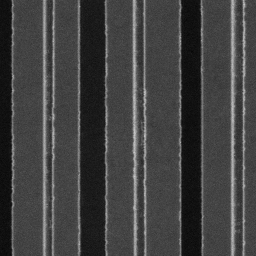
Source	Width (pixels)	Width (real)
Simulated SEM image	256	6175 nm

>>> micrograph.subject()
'lines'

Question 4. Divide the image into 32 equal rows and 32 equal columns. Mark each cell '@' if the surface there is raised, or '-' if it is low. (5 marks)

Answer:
--@@@@@@@@---@@@@@@@@@@--@@@@@@@
--@@@@@@@@---@@@@@@@@@@--@@@@@@@
--@@@@@@@@---@@@@@@@@@---@@@@@@@
--@@@@@@@@---@@@@@@@@@---@@@@@@@
--@@@@@@@@---@@@@@@@@@@--@@@@@@@
--@@@@@@@@---@@@@@@@@@@--@@@@@@@
--@@@@@@@@---@@@@@@@@@@--@@@@@@@
--@@@@@@@@---@@@@@@@@@@--@@@@@@@
--@@@@@@@@---@@@@@@@@@@--@@@@@@@
--@@@@@@@@---@@@@@@@@@@--@@@@@@@
--@@@@@@@@---@@@@@@@@@@--@@@@@@@
--@@@@@@@@---@@@@@@@@@@--@@@@@@@
--@@@@@@@@---@@@@@@@@@@--@@@@@@@
--@@@@@@@@---@@@@@@@@@@--@@@@@@@
--@@@@@@@@---@@@@@@@@@@--@@@@@@@
--@@@@@@@@---@@@@@@@@@@--@@@@@@@
--@@@@@@@@---@@@@@@@@@@--@@@@@@@
--@@@@@@@@---@@@@@@@@@@--@@@@@@@
--@@@@@@@@---@@@@@@@@@@--@@@@@@@
--@@@@@@@@---@@@@@@@@@@--@@@@@@@
--@@@@@@@@---@@@@@@@@@@--@@@@@@@
--@@@@@@@@---@@@@@@@@@@--@@@@@@@
--@@@@@@@@---@@@@@@@@@@--@@@@@@@
--@@@@@@@@---@@@@@@@@@@--@@@@@@@
--@@@@@@@@---@@@@@@@@@@--@@@@@@@
--@@@@@@@@---@@@@@@@@@@--@@@@@@@
--@@@@@@@@---@@@@@@@@@@--@@@@@@@
--@@@@@@@@---@@@@@@@@@@--@@@@@@@
--@@@@@@@@---@@@@@@@@@@--@@@@@@@
--@@@@@@@@---@@@@@@@@@@--@@@@@@@
--@@@@@@@@---@@@@@@@@@@--@@@@@@@
--@@@@@@@@---@@@@@@@@@@--@@@@@@@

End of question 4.